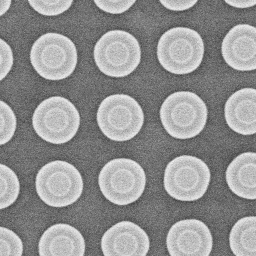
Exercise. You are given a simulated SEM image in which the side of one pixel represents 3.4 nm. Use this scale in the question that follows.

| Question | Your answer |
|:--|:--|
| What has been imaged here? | an array of small figures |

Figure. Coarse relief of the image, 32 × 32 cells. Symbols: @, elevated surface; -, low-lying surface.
@---@@@@@---@@@@@---@@@@-----@@@
@----@@@------@-----------------
--------------------------------
----------------------@------@@@
-----@@@-----@@@@---@@@@@---@@@@
@---@@@@@---@@@@@---@@@@@---@@@@
@---@@@@@@--@@@@@---@@@@@---@@@@
@@--@@@@@@--@@@@@---@@@@@---@@@@
@---@@@@@---@@@@@----@@@@----@@@
@----@@@------@-----------------
--------------------------------
------------------------------@@
------@@-----@@@@----@@@@----@@@
@----@@@@---@@@@@@--@@@@@@--@@@@
@@--@@@@@@--@@@@@@--@@@@@@--@@@@
@@--@@@@@@--@@@@@@--@@@@@@--@@@@
@@---@@@@----@@@@----@@@@-----@@
@-----@@@-----@@----------------
--------------------------------
-----------------------@------@@
------@@@----@@@@----@@@@@---@@@
@@---@@@@@---@@@@@---@@@@@--@@@@
@@---@@@@@--@@@@@@---@@@@@--@@@@
@@---@@@@@---@@@@@---@@@@@---@@@
@@---@@@@@---@@@@----@@@@-----@@
@-----@@@------@----------------
--------------------------------
-----------------------@@-----@@
------@@@-----@@@----@@@@@---@@@
@@---@@@@@---@@@@@---@@@@@---@@@
@@@--@@@@@@--@@@@@@--@@@@@---@@@
@@@--@@@@@---@@@@@---@@@@@---@@@